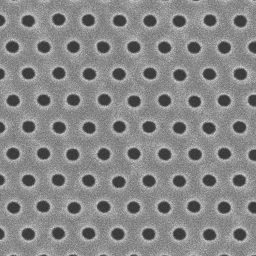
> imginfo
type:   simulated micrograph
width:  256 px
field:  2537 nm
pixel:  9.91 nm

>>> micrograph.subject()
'a regular array of holes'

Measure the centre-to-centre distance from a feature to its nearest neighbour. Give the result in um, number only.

0.295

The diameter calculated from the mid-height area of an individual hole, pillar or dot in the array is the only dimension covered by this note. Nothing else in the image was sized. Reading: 0.128 micrometres